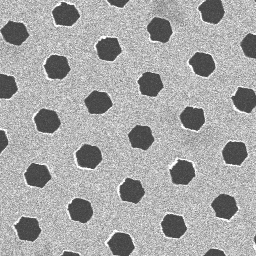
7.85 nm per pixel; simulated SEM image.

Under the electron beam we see a regular array of holes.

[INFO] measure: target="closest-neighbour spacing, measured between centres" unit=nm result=426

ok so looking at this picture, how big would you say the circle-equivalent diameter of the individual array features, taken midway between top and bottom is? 0.193 micrometres